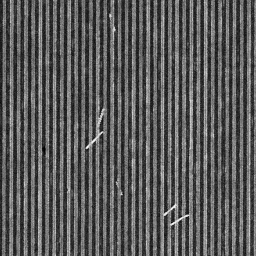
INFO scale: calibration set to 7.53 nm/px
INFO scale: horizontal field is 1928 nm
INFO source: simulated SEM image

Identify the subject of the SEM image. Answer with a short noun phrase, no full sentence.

parallel lines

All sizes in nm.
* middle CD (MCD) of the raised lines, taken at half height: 20.7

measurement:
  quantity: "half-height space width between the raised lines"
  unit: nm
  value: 31.1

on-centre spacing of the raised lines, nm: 54.1